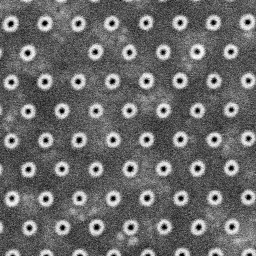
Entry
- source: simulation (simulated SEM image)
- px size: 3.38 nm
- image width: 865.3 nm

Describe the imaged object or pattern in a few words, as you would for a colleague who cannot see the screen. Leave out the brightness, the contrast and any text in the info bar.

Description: a regular array of ring-shaped raised bodies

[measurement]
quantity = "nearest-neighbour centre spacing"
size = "112 nm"